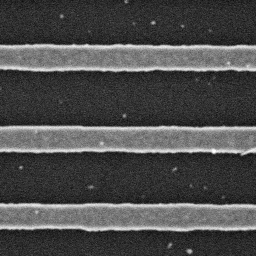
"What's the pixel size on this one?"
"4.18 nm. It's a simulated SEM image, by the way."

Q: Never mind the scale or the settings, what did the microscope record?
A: lines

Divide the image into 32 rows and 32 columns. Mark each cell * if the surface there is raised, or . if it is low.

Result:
................................
................................
................................
................................
................................
................................
********************************
********************************
********************************
................................
................................
................................
................................
................................
................................
................................
********************************
********************************
********************************
................................
................................
................................
................................
................................
................................
*****.....****.**..******.......
********************************
********************************
********************************
................................
................................
................................